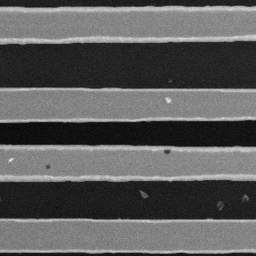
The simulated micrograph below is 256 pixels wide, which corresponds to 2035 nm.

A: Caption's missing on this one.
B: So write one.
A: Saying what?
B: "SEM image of lines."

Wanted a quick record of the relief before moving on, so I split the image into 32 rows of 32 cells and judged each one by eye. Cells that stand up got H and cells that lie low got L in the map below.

LLLLLLLLLLLLLLLLLLLLLLLLLLLLLLLL
HHHHHHHHHHHHHHHHHHHHHHHHHHHHHHHH
HHHHHHHHHHHHHHHHHHHHHHHHHHHHHHHH
HHHHHHHHHHHHHHHHHHHHHHHHHHHHHHHH
HHHHHHHHHHHHHHHHHHHHHHHHHHHHHHHH
LLLLLLLLLLLLLLLLLLLLLLLLLLLLLLLL
LLLLLLLLLLLLLLLLLLLLLLLLLLLLLLLL
LLLLLLLLLLLLLLLLLLLLLLLLLLLLLLLL
LLLLLLLLLLLLLLLLLLLLLLLLLLLLLLLL
LLLLLLLLLLLLLLLLLLLLLLLLLLLLLLLL
LLLLLLLLLLLLLLLLLLLLLLLLLLLLLLLL
HHHHHHHHHHHHHHHHHHHHHHHHHHHHHHHH
HHHHHHHHHHHHHHHHHHHHHHHHHHHHHHHH
HHHHHHHHHHHHHHHHHHHHHHHHHHHHHHHH
HHHHHHHHHHHHHHHHHHHHHHHHHHHHHHHH
LLLLLLLLLLLLLLLLLLLLLLLLLLLLLLLL
LLLLLLLLLLLLLLLLLLLLLLLLLLLLLLLL
LLLLLLLLLLLLLLLLLLLLLLLLLLLLLLLL
HHHHHHHHHHHHHHHHHHHHHHHHHHHHHHHH
HHHHHHHHHHHHHHHHHHHHHHHHHHHHHHHH
HHHHHHHHHHHHHHHHHHHHHHHHHHHHHHHH
HHHHHHHHHHHHHHHHHHHHHHHHHHHHHHHH
HHHHHHHHHHHLLHHHLLHLHHLLLLLLLLLL
LLLLLLLLLLLLLLLLLLLLLLLLLLLLLLLL
LLLLLLLLLLLLLLLLLLLLLLLLLLLLLLLL
LLLLLLLLLLLLLLLLLLLLLLLLLLLLLLLL
LLLLLLLLLLLLLLLLLLLLLLLLLLLLLLLL
HHHLLLLHLHHLLLLLLLLLLLLLLLLLLLLL
HHHHHHHHHHHHHHHHHHHHHHHHHHHHHHHH
HHHHHHHHHHHHHHHHHHHHHHHHHHHHHHHH
HHHHHHHHHHHHHHHHHHHHHHHHHHHHHHHH
HHHHHHHHHHHHHHHHHHHHHHHHHHHHHHHH